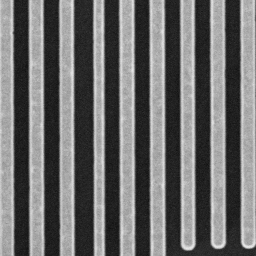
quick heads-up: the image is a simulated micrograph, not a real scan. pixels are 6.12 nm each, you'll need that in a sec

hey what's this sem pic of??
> parallel lines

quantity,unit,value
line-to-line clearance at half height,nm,104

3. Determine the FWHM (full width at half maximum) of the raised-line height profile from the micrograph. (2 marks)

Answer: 81.2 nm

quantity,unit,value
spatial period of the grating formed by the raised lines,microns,0.185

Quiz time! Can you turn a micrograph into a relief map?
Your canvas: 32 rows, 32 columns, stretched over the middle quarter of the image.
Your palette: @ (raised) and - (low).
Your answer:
@@------@@----@@@-----@@@----@@@
@@------@@----@@@-----@@@----@@@
@@------@@----@@@-----@@@----@@@
@@------@@----@@@-----@@@----@@@
@@------@@----@@@-----@@@----@@@
@@------@@----@@@-----@@@----@@@
@@------@@----@@@-----@@@----@@@
@@------@@----@@@-----@@@----@@@
@@------@@----@@@-----@@@----@@@
@@------@@----@@@-----@@@----@@@
@@------@@----@@@-----@@@----@@@
@@------@@----@@@-----@@@----@@@
@@------@@----@@@-----@@@----@@@
@@------@@----@@@-----@@@----@@@
@@------@@----@@@-----@@@----@@@
@@------@@----@@@-----@@@----@@@
@@------@@----@@@-----@@@----@@@
@@------@@----@@@-----@@@----@@@
@@------@@----@@@-----@@@----@@@
@@------@@----@@@-----@@@----@@@
@@------@@----@@@-----@@@----@@@
@@------@@----@@@-----@@@----@@@
@@------@@----@@@-----@@@----@@@
@@------@@----@@@-----@@@----@@@
@@------@@----@@@-----@@@----@@@
@@------@@----@@@-----@@@----@@@
@@------@@----@@@-----@@@----@@@
@@------@@----@@@-----@@@----@@@
@@------@@----@@@-----@@@----@@@
@@------@@----@@@-----@@@----@@@
@@------@@----@@@-----@@@----@@@
@@------@@----@@@-----@@@----@@@